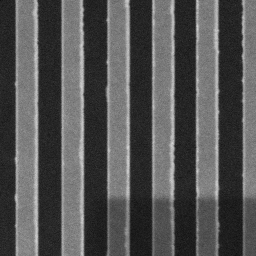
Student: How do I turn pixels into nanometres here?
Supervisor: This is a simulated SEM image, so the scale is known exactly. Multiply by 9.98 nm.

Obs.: lines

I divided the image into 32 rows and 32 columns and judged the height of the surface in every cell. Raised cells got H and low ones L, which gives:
LLHHHLLLHHLLLLHHLLLHHHLLLHHLLLHH
LLHHHLLLHHLLLLHHLLLHHHLLLHHLLLHH
LLHHHLLLHHLLLHHHLLLHHHLLLHHLLLHH
LLHHHLLLHHLLLLHHLLLHHHLLLHHLLLHH
LLHHHLLLHHLLLLHHLLLHHHLLLHHLLLHH
LLHHHLLLHHLLLLHHLLLHHHLLLHHLLLHH
LLHHHLLLHHLLLLHHLLLHHHLLLHHLLLHH
LLHHHLLLHHLLLHHHLLLHHHLLLHHLLLHH
LLHHHLLLHHLLLLHHLLLHHHLLLHHLLLHH
LLHHHLLLHHLLLLHHLLLHHHLLLHHLLLHH
LLHHHLLLHHLLLLHHLLLHHHLLLHHLLLHH
LLHHHLLLHHLLLLHHLLLHHHLLLHHLLLHH
LLHHHLLLHHLLLLHHLLLHHHLLLHHLLLHH
LLHHHLLLHHLLLLHHLLLHHHLLLHHLLLHH
LLHHHLLLHHLLLLHHLLLHHHLLLHHLLLHH
LLHHHLLLHHLLLLHHLLLHHHLLLHHLLLHH
LLHHHLLLHHLLLLHHLLLHHHLLLHHLLLHH
LLHHHLLLHHLLLLHHLLLHHHLLLHHLLLHH
LLHHHLLLHHLLLLHHLLLHHHLLLHHLLLHH
LLHHHLLLHHLLLLHHLLLHHHLLLHHLLLHH
LLHHHLLLHHLLLLHHLLLHHHLLLHHLLLHH
LLHHHLLLHHLLLLHHLLLHHHLLLHHLLLHH
LLHHHLLLHHLLLLHHLLLHHHLLLHHLLLHH
LLHHHLLLHHLLLLHHLLLHHHLLLHHLLLHH
LLHHHLLLHHLLLLHHLLLHHHLLLHHLLLHH
LLHHHLLLHHLLLLHHLLLHHHLLLHHLLLHH
LLHHHLLLHHLLLLHHLLLHHHLLLHHLLLHH
LLHHHLLLHHLLLLHHLLLHHHLLLHHLLLHH
LLHHHLLLHHLLLLHHLLLHHHLLLHHLLLHH
LLHHHLLLHHLLLLHHLLLHHHLLLHHLLLHH
LLHHHLLLHHLLLLHHLLLHHHLLLHHLLLHH
LLHHHLLLHHLLLLHHLLLHHHLLLHHLLLHH